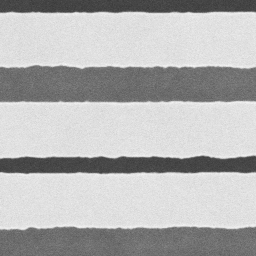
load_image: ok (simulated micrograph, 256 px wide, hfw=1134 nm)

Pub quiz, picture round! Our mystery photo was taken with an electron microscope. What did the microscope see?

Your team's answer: lines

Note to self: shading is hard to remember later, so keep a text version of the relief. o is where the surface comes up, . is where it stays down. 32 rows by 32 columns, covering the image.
................................
................o...............
oooooooooooooooooooooooooooooooo
oooooooooooooooooooooooooooooooo
oooooooooooooooooooooooooooooooo
oooooooooooooooooooooooooooooooo
oooooooooooooooooooooooooooooooo
oooooooooooooooooooooooooooooooo
..........o...................o.
................................
................................
................................
................................
oooooooooooooooooooooooooooooooo
oooooooooooooooooooooooooooooooo
oooooooooooooooooooooooooooooooo
oooooooooooooooooooooooooooooooo
oooooooooooooooooooooooooooooooo
oooooooooooooooooooooooooooooooo
ooooooooooooooooooooooooo.ooooo.
................................
................................
oooooooooooooooooooooooooooooooo
oooooooooooooooooooooooooooooooo
oooooooooooooooooooooooooooooooo
oooooooooooooooooooooooooooooooo
oooooooooooooooooooooooooooooooo
oooooooooooooooooooooooooooooooo
ooo..........o..o...........oo..
................................
................................
................................